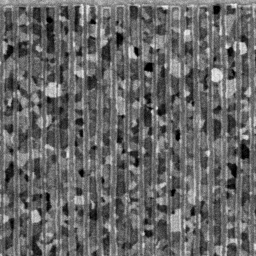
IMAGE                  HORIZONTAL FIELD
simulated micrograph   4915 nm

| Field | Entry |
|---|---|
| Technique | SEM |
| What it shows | parallel lines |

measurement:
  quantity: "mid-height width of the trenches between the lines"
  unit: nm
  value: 84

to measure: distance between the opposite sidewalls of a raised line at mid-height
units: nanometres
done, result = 185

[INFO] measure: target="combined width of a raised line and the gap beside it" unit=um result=0.267